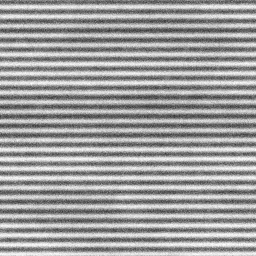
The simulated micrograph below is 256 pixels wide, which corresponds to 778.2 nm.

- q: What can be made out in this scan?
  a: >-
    parallel lines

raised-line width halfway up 10.2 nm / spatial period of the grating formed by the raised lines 28.9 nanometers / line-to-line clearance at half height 18.2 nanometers